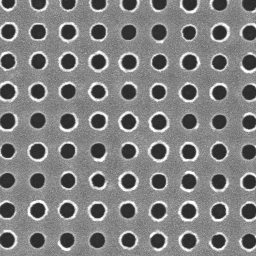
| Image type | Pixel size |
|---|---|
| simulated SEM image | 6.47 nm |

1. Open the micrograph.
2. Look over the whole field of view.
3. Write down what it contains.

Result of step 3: a regular array of holes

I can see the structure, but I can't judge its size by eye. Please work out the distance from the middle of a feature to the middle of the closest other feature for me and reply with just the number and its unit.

192 nm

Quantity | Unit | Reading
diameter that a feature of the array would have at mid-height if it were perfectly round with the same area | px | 15.3